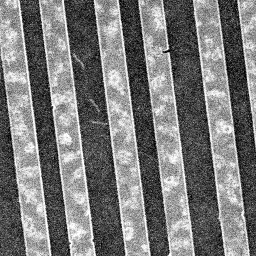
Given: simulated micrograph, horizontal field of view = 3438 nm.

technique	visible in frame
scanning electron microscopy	parallel lines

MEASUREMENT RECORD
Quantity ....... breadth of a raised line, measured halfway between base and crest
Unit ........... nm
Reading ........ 313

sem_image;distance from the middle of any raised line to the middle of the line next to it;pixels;49.6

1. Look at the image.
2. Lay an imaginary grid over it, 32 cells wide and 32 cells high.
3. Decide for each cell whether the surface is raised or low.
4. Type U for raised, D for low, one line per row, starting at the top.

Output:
UUDDDUUUDDDDUUUDDUUUDDDDUUUDDDUU
UUUDDUUUDDDDUUUDDDUUDDDDUUUDDDUU
UUUDDUUUDDDDUUUDDDUUUDDDUUUUDDUU
UUUDDUUUDDDDUUUDDDUUUDDDDUUUDDUU
UUUDDDUUDDDDUUUDDDUUUDDDDUUUDDUU
UUUDDDUUUDDDUUUDDDUUUDDDDUUUDDUU
UUUDDDUUUDDDDUUUDDUUUDDDDUUUDDDU
UUUDDDUUUDDDDUUUDDUUUDDDDUUUDDDU
UUUDDDUUUDDDDUUUDDUUUDDDDUUUDDDU
DUUUDDUUUDDDDUUUDDDUUUDDDUUUDDDU
DUUUDDUUUDDDDUUUDDDUUUDDDUUUUDDU
DUUUDDUUUDDDDUUUDDDUUUDDDDUUUDDU
DUUUDDUUUDDDDUUUDDDUUUDDDDUUUDDU
DUUUDDDUUUDDDUUUDDDUUUDDDDUUUDDU
DUUUDDDUUUDDDDUUDDDUUUDDDDUUUDDD
DUUUDDDUUUDDDDUUUDDUUUDDDDUUUDDD
DUUUDDDUUUDDDDUUUDDUUUDDDDUUUDDD
DDUUUDDUUUDDDDUUUDDDUUUDDDUUUDDD
DDUUUDDUUUDDDDUUUDDDUUUDDDUUUDDD
DDUUUDDUUUDDDDUUUDDDUUUDDDDUUUDD
DDUUUDDUUUDDDDUUUDDDUUUDDDDUUUDD
DDUUUDDDUUUDDDUUUDDDUUUDDDDUUUDD
DDUUUDDDUUUDDDDUUUDDUUUDDDDUUUDD
DDUUUDDDUUUDDDDUUUDDUUUDDDDUUUDD
DDUUUDDDUUUDDDDUUUDDUUUDDDDUUUDD
DDDUUUDDUUUDDDDUUUDDDUUUDDDUUUDD
DDDUUUDDUUUDDDDUUUDDDUUUDDDUUUDD
DDDUUUDDUUUDDDDUUUDDDUUUDDDDUUUD
DDDUUUDDUUUDDDDUUUDDDUUUDDDDUUUD
DDDUUUDDDUUUDDDUUUDDDUUUDDDDUUUD
DDDUUUDDDUUUDDDDUUDDDUUUDDDDUUUD
DDDUUUDDDUUUDDDDUUUDDUUUDDDDUUUD